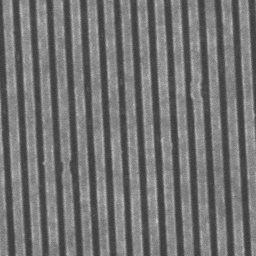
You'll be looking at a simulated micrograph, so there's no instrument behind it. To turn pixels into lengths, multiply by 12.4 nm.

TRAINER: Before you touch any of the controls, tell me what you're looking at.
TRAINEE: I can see parallel lines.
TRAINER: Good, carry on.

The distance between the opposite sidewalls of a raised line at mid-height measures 8.99 px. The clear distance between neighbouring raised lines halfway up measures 0.0987 µm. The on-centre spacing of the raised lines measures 0.208 microns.